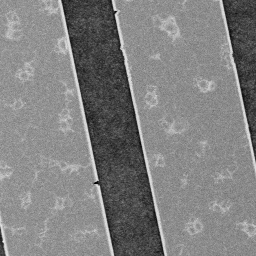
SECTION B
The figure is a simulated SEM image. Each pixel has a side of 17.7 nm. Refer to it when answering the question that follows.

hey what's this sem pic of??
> one or a few lines or trenches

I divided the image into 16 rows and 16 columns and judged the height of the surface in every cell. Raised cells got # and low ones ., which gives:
####...#######..
####...#######..
####....######..
####....#######.
#####...#######.
#####...#######.
#####...#######.
#####....######.
######...#######
######...#######
######...#######
######...#######
######....######
#######...######
#######...######
#######...######